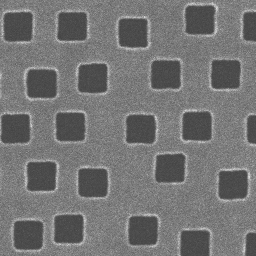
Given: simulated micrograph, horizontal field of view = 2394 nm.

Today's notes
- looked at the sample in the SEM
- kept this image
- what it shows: a regular array of holes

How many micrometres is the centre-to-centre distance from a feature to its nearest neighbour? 0.481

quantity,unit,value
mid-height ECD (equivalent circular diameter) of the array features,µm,0.3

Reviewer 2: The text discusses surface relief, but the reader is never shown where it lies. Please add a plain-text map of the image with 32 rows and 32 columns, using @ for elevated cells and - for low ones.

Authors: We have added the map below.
@@@@@@@@@@@@@@@@@@@@@@@@@@@@@@@@
@@@@@@@@-@@@@@@@@@@@@@@----@@@@@
----@@@----@@@@---@@@@@----@@@--
@---@@@----@@@@---@@@@@----@@@--
@---@@@----@@@@---@@@@@@@@@@@@--
@@@@@@@@@@@@@@@---@@@@@@@@@@@@@@
@@@@@@@@@@@@@@@@@@@@@@@@@@@@@@@@
@@@@@@@@@@@@@@@@@@@@--@@@@@--@@@
@@@@@@@@@@---@@@@@@----@@@----@@
@@@----@@@---@@@@@@----@@@----@@
@@@----@@@---@@@@@@----@@@----@@
@@@----@@@---@@@@@@@@@@@@@@@@@@@
@@@@@@@@@@@@@@@@@@@@@@@@@@@@@@@@
@@@@@@@@@@@@@@@@@@@@@@@@@@@@@@@@
---@@@@----@@@@@---@@@@---@@@@@-
----@@@----@@@@@----@@@----@@@@-
----@@@----@@@@@---@@@@----@@@@-
----@@@---@@@@@@---@@@@---@@@@@-
@@@@@@@@@@@@@@@@@@@@@@@@@@@@@@@@
@@@@@@@@@@@@@@@@@@@@---@@@@@@@@@
@@@@---@@@@@@@@@@@@----@@@@@@@@@
@@@----@@@---@@@@@@----@@@@@---@
@@@----@@@---@@@@@@@---@@@@----@
@@@@---@@@---@@@@@@@@@@@@@@----@
@@@@@@@@@@---@@@@@@@@@@@@@@----@
@@@@@@@@@@@@@@@@@@@@@@@@@@@@@@@@
@@@@@@@@@@@@@@@@@@@@@@@@@@@@@@@@
@@@@@@@---@@@@@@----@@@@@@@@@@@@
@@---@@---@@@@@@----@@@@@@@@@@@@
@@---@@---@@@@@@----@@@---@@@@@-
@@---@@@@@@@@@@@---@@@@---@@@@@-
@@@@@@@@@@@@@@@@@@@@@@@---@@@@@-